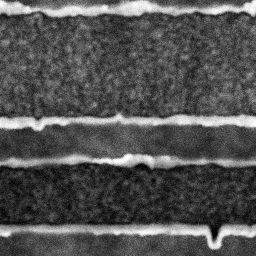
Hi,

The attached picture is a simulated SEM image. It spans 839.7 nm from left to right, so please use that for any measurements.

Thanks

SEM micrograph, one or a few lines or trenches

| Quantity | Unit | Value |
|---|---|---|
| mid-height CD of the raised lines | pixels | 44.6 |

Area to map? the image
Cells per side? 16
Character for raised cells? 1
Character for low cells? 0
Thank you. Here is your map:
1111111111111111
0000000000000000
0000000000000000
0000000000000000
0000000000000000
0000000000000000
0000000000000000
0001111111111111
1111111111111111
1111111111111111
0000000000000000
0000000000000000
0000000000000000
0000000000000000
1111111111111011
1111111111111111